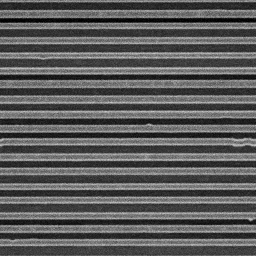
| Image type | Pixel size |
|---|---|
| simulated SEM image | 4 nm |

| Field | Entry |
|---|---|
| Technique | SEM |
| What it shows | parallel lines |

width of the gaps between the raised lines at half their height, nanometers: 31.5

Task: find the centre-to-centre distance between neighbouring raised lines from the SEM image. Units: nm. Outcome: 56.9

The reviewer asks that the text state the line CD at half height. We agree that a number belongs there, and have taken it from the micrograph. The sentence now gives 27.5 nm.